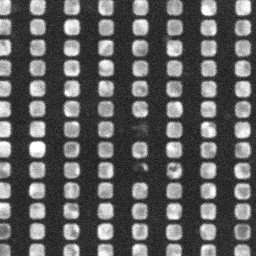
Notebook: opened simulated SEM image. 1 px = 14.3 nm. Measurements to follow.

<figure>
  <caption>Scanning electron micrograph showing a regular array of raised bodies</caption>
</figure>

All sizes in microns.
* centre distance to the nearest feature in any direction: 0.29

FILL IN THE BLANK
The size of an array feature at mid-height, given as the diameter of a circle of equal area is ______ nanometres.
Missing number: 223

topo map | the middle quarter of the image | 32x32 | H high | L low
HHHHLLLLLHHHLLLLLLHHHLLLLLHHHLLL
HHHLLLLLLHHHLLLLLHHHHLLLLLHHHLLL
LHHLLLLLLHHHLLLLLLHHHLLLLLHHHLLL
LLLLLLLLLLLLLLLLLLLLLLLLLLLLLLLL
LHHLLLLLLHHHLLLLLLLLLLLLLLLLLLLL
HHHHLLLLLHHHLLLLLHHHHLLLLLHHHLLL
HHHHLLLLLHHHLLLLLHHHHLLLLLHHHLLL
LHHLLLLLLHHHLLLLLHHHHLLLLLHHHLLL
LLLLLLLLLLLLLLLLLLLLLLLLLLLLLLLL
LLLLLLLLLLLLLLLLLLLLLLLLLLLLLLLL
HHHHLLLLLHHHLLLLLHHHHLLLLLHHHLLL
HHHHLLLLLHHHLLLLLHHHHLLLLLHHHLLL
HHHLLLLLLHHHLLLLLLHHLLLLLLHHHLLL
LLLLLLLLLLLLLLLLLLLLLLLLLLLLLLLL
LLLLLLLLLLLLLLLLLLLLLLLLLLLLLLLL
HHHHLLLLLHHHLLLLLLLLLLLLLLHHHLLL
HHHHLLLLLHHHLLLLLLLLLLLLLLHHHLLL
HHHHLLLLLHHHLLLLLLLLLLLLLLHHHLLL
LLLLLLLLLLLLLLLLLLLLLLLLLLLLLLLL
LLLLLLLLLLLLLLLLLLLLLLLLLLLLLLLL
HHHHLLLLLHHHLLLLLHHHHLLLLLHHHLLL
HHHLLLLLLHHHLLLLLHHHHLLLLLHHHLLL
HHHLLLLLLHHHLLLLLHHHHLLLLLHHHLLL
LLLLLLLLLLLLLLLLLLLLLLLLLLLLLLLL
LLLLLLLLLLLLLLLLLLLLLLLLLLLLLLLL
HHHLLLLLLHHHLLLLLLLLLLLLLLLLLLLL
HHHLLLLLLHHHLLLLLLLLLLLLLLLLLLLL
HHHLLLLLLHHHLLLLLLLLLLLLLLLLLLLL
LLLLLLLLLLLLLLLLLLLLLLLLLLLLLLLL
LLLLLLLLLLLLLLLLLLLLLLLLLLLLLLLL
HHHLLLLLLHHHLLLLLHHHLLLLLLHHHLLL
HHHHLLLLLHHHLLLLLHHHHLLLLLHHHLLL